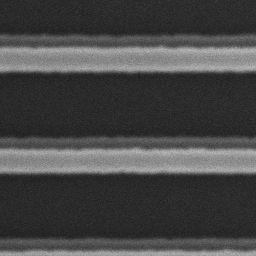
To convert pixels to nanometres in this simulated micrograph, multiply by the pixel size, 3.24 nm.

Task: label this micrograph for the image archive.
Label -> lines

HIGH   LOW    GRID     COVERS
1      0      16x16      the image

0000000000000000
0000000000000000
1111111111111111
1111111111111111
1000000000000000
0000000000000000
0000000000000000
0000000000000000
0000000000000000
1111111111111111
1111111111111111
0000000000000000
0000000000000000
0000000000000000
0000000000000000
1111111111111111